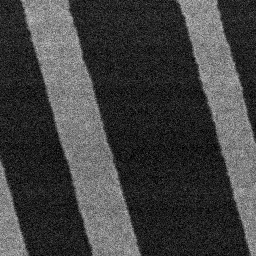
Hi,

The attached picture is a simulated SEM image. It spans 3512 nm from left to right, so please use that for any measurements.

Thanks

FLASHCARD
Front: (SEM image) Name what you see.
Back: one or a few lines or trenches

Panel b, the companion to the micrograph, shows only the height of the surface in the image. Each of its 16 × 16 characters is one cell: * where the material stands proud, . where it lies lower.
..**.......***..
..***.......**..
..***.......**..
..***.......**..
...**.......***.
...***.......**.
...***.......**.
...***.......***
....***.......**
....***.......**
....***.......**
.....**........*
*....***.......*
*....***.......*
*....***.......*
**....***.......